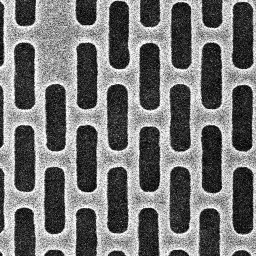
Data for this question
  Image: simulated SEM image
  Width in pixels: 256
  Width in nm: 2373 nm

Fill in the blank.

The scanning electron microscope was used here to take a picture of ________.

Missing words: a regular array of holes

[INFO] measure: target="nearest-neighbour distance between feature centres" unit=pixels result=51.3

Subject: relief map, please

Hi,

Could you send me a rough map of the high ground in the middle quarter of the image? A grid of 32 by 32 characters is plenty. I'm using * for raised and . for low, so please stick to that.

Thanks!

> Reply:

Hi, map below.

***......***....***.....***....*
***......**********.....********
***......**********.....********
***......**********.....********
***.....***********.....********
***.....****...****.....***....*
***.....***.....***.....**......
.**.....***.....***.....**......
.**.....***.....***.....**......
.**.....***.....***.....**......
.**.....***.....***.....**......
.****.*****.....*****.****......
.**********.....***********.....
.**********.....***********.....
.**********.....***********.....
.***...****.....****..****......
.**.....***.....***.....**......
.**.....***.....***.....**......
.**.....***.....***.....**......
.**.....***.....***.....**......
***.....***.....***.....***.....
***.....****...****.....***....*
***.....***********.....********
***.....***********.....********
***.....***********.....********
***.....***********.....********
***.....***.....***.....***....*
***.....***.....***.....**......
***.....***.....***.....**......
***.....***.....***.....**......
***.....***.....***.....**......
****....***.....***....***......